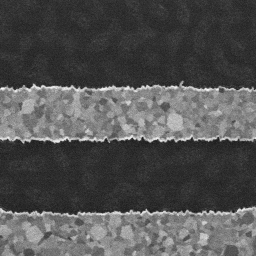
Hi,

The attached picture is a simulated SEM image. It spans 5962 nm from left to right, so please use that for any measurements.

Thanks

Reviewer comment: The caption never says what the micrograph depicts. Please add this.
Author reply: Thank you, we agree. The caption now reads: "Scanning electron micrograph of one or a few lines or trenches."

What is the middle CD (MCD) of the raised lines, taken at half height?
1200 nm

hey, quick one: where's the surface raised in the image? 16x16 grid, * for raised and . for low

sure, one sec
................
................
................
................
................
..**...*.***....
****************
****************
****************
................
................
................
................
****************
****************
****************